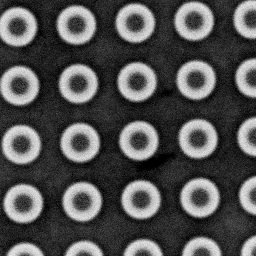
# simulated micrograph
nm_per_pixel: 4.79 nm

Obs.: an array of small figures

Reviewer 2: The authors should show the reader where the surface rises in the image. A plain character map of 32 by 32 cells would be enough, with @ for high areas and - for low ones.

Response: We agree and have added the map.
-----------------------@@-----@@
-@@@----@@@----@@@@---@@@@---@@@
@@@@---@@@@@---@@@@---@@@@@--@@@
@@@@@--@@@@@---@@@@---@@@@----@@
@@@@----@@@----@@@@----@@@-----@
-@@-----------------------------
--------------------------------
-------------------------------@
--@------@@-----@@@----@@@----@@
@@@@----@@@@---@@@@---@@@@@---@@
@@@@@--@@@@@---@@@@---@@@@@---@@
@@@@@---@@@@---@@@@----@@@----@@
-@@@-----@@-----@@--------------
--------------------------------
--------------------------------
----------------@@@----@@@----@@
-@@@----@@@@---@@@@----@@@@---@@
@@@@@---@@@@---@@@@@--@@@@@---@@
@@@@@---@@@@---@@@@@---@@@@---@@
-@@@@---@@@@----@@@-----@@------
--------------------------------
--------------------------------
------------------------@@-----@
--@@-----@@@----@@@----@@@@---@@
-@@@@---@@@@@--@@@@@---@@@@---@@
-@@@@---@@@@@--@@@@@---@@@@---@@
-@@@@---@@@@----@@@----@@@@----@
--@@------@---------------------
--------------------------------
--------------------------------
---@-----@@@----@@@----@@@@----@
-@@@@---@@@@@---@@@@---@@@@@--@@